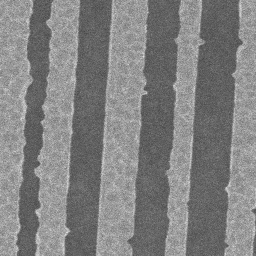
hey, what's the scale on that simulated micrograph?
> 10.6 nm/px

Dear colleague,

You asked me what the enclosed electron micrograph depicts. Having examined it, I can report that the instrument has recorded one or a few lines or trenches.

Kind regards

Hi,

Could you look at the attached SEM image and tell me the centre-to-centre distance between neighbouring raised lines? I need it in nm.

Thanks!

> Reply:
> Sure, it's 666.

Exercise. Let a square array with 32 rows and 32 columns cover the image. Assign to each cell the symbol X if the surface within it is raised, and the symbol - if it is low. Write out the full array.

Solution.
XXXX--XXXX----XXXX-----XX-----XX
XXXX--XXXX----XXXX----XXX-----XX
XXXX--XXXX----XXXX-----XX-----XX
XXXX--XXXX----XXXX-----XX-----XX
XXXX--XXXX----XXXX----XXX-----XX
XXX---XXXX----XXXX----XXX-----XX
XXX---XXXX----XXXX----XXX-----XX
XXX---XXXX----XXXX----XXX-----XX
XXXX--XXX-----XXXX----XXX-----XX
XXXX--XXX-----XXXX----XXX----XXX
XXXX--XXX-----XXXX----XX------XX
XXX---XXX----XXXXX----XX-----XXX
XXX---XXX----XXXXX----XX-----XXX
XXX--XXXX----XXXXX----XX-----XXX
XXX---XXX----XXXXX----XX-----XXX
XXX--XXXX----XXXXX----XX-----XXX
XXX--XXXX----XXXX-----XX-----XXX
XXX--XXXX----XXXX-----XX-----XXX
XXX--XXXX----XXXX-----XX-----XXX
XXX--XXXX----XXXX----XXX-----XXX
XXX--XXXX----XXXX----XXX-----XXX
XXX-XXXX-----XXXX----XXX-----XXX
XXX--XXX-----XXXX----XXX-----XXX
XXX--XXX-----XXXX----XXX----XXXX
XX---XXX-----XXXX----XXX-----XXX
XX---XXX-----XXXX----XX------XXX
XX---XXX----XXXXX----XX-----XXXX
XX---XXX----XXXXX----XX-----XXXX
XX---XXX----XXXXX----XX-----XXXX
XX---XXX----XXXX-----XX-----XXXX
XX---XXX----XXXX-----XX-----XXXX
XX---XXX----XXXX-----XX-----XXX-